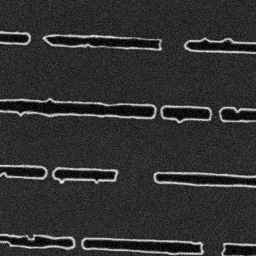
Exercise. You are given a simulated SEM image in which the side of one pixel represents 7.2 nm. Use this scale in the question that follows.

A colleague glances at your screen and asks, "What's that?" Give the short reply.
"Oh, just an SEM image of one or a few lines or trenches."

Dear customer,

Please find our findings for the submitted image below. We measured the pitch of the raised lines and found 0.484 micrometres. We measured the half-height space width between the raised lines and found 405 nanometers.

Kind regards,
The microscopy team